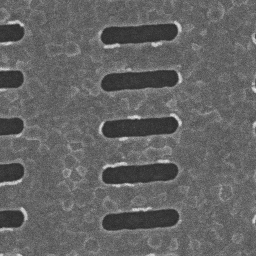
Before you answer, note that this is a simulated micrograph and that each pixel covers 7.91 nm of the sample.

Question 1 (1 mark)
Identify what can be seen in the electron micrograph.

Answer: holes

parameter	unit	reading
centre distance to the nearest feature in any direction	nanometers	367